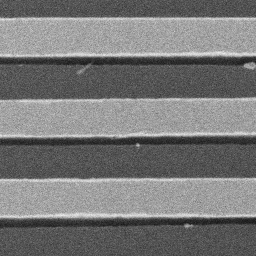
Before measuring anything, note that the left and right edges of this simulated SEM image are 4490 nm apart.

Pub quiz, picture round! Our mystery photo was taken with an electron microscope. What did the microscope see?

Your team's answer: lines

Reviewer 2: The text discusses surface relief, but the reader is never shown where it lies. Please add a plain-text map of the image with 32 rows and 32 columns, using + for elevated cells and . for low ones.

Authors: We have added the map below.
................................
................................
++++++++++++++++++++++++++++++++
++++++++++++++++++++++++++++++++
++++++++++++++++++++++++++++++++
++++++++++++++++++++++++++++++++
++++++++++++++++++++++++++++++++
................................
................................
................................
................................
................................
..+..+.+++++++++++++++++++++++++
++++++++++++++++++++++++++++++++
++++++++++++++++++++++++++++++++
++++++++++++++++++++++++++++++++
++++++++++++++++++++++++++++++++
................................
................................
................................
................................
................................
++++++++++++++++++++++++++++++++
++++++++++++++++++++++++++++++++
++++++++++++++++++++++++++++++++
++++++++++++++++++++++++++++++++
++++++++++++++++++++++++++++++++
................................
................................
................................
................................
................................